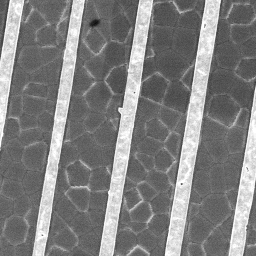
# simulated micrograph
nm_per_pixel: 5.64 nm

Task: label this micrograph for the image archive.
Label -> one or a few lines or trenches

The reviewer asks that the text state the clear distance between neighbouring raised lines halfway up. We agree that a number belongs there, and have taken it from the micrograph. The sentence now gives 51.6 px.